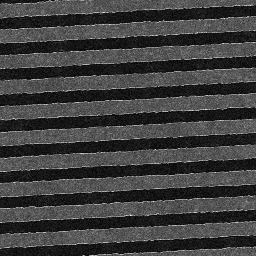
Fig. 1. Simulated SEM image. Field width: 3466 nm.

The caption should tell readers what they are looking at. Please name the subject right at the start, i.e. parallel lines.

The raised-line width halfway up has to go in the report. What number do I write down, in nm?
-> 186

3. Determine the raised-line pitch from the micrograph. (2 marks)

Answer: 346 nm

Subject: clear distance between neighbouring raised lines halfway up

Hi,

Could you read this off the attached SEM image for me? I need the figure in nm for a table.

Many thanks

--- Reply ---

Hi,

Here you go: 159